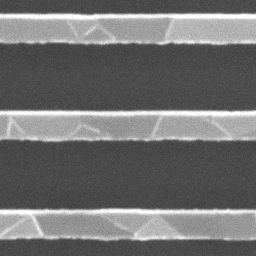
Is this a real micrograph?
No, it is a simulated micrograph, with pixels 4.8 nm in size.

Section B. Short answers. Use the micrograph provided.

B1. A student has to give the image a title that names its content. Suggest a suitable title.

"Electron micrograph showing lines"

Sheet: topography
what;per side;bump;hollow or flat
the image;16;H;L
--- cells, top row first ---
LLLLLLLLLLLLLLLL
HHHHHHHHHHHHHHHH
HHHHHHHHHHHHHHHH
LLLLLLLLLLLLLLLL
LLLLLLLLLLLLLLLL
LLLLLLLLLLLLLLLL
LLLLLLLLLLLLLLLL
HHHHHHHHHHHHHHHH
HHHHHHHHHHHHHHHH
LLLLLLLLLLLLLLLL
LLLLLLLLLLLLLLLL
LLLLLLLLLLLLLLLL
LLLLLLLLLLLLLLLL
HHHHHHHHHHHHHHHH
HHHHHHHHHHHHHHHH
LLLLLLLLLLLLLLLL